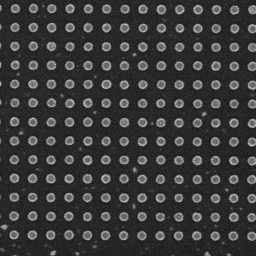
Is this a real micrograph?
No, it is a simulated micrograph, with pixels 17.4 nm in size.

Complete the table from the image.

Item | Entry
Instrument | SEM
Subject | a regular array of raised bodies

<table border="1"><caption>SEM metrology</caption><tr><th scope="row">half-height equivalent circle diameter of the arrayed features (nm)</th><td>147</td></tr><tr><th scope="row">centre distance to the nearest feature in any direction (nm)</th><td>315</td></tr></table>